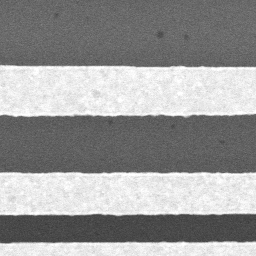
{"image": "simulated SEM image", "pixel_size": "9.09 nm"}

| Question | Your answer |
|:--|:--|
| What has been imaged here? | lines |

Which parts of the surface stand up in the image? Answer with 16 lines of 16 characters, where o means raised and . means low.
................
................
................
................
oooooooooooooooo
oooooooooooooooo
oooooooooooooooo
................
................
................
................
oooooooooooooooo
oooooooooooooooo
................
................
oooooooooooooooo